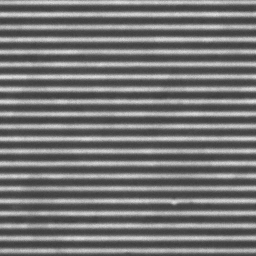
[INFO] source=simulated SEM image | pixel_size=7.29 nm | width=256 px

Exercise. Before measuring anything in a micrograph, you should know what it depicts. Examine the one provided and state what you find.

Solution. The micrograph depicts parallel lines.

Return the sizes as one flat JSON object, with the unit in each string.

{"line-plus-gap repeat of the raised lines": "90.4 nm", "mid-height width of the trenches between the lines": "57.4 nanometers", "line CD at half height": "35.5 nm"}